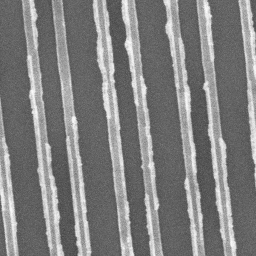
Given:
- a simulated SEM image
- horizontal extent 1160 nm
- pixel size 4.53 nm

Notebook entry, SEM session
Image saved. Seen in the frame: parallel lines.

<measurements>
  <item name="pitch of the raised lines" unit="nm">160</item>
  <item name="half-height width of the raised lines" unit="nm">52.4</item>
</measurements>